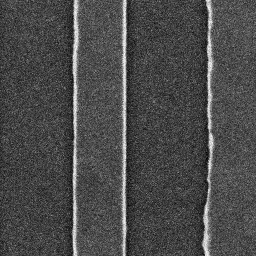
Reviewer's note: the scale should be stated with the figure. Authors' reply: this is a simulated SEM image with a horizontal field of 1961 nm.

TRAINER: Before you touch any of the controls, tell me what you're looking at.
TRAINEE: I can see one or a few lines or trenches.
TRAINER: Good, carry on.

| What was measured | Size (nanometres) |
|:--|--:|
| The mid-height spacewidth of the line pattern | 647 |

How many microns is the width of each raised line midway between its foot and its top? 0.378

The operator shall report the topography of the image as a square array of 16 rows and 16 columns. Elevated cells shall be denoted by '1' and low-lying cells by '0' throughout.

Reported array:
0000011100000111
0000011100000111
0000011100000111
0000011100000111
0000011100000111
0000011100000111
0000011100000111
0000011100000111
0000011100000111
0000011100000111
0000011100000111
0000011100000111
0000011100000111
0000011100000111
0000011100000111
0000011100000111